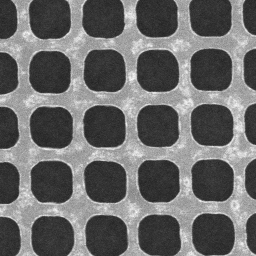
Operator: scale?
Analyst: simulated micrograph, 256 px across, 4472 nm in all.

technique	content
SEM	a regular array of holes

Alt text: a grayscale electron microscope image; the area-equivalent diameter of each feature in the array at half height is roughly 0.79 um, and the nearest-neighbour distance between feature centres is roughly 931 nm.